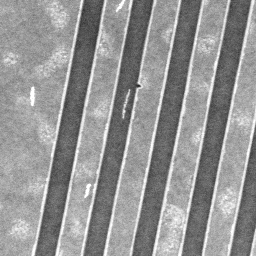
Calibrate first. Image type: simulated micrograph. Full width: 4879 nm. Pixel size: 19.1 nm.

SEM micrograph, parallel lines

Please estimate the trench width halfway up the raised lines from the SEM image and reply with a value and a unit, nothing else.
423 nm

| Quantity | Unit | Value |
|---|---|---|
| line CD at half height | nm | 491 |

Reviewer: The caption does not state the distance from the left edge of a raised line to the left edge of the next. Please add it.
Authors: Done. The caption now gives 0.91 microns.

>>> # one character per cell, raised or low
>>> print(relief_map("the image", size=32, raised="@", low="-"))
@@@@@@@@@@---@@@---@@@---@@@@--@
@@@@@@@@@@---@@@---@@@---@@@---@
@@@@@@@@@@---@@@---@@@---@@@---@
@@@@@@@@@@---@@@---@@@---@@@---@
@@@@@@@@@@--@@@@--@@@@---@@@---@
@@@@@@@@@---@@@---@@@@--@@@@--@@
@@@@@@@@@---@@@---@@@---@@@---@@
@@@@@@@@@---@@@---@@@---@@@---@@
@@@@@@@@@---@@@---@@@---@@@---@@
@@@@@@@@@--@@@@--@@@@---@@@---@@
@@@@@@@@---@@@---@@@@--@@@@---@@
@@@@@@@@---@@@---@@@---@@@---@@@
@@@@@@@@---@@@---@@@---@@@---@@@
@@@@@@@@---@@@---@@@---@@@---@@@
@@@@@@@@--@@@@---@@@---@@@---@@@
@@@@@@@---@@@---@@@@--@@@@--@@@@
@@@@@@@---@@@---@@@---@@@---@@@@
@@@@@@@---@@@---@@@---@@@---@@@-
@@@@@@@---@@@---@@@---@@@---@@@-
@@@@@@@--@@@@---@@@---@@@---@@@-
@@@@@@---@@@@--@@@@--@@@@--@@@@-
@@@@@@---@@@---@@@---@@@---@@@@-
@@@@@@---@@@---@@@---@@@---@@@--
@@@@@@---@@@---@@@---@@@---@@@--
@@@@@@--@@@@---@@@---@@@---@@@--
@@@@@---@@@@--@@@@--@@@@--@@@@--
@@@@@---@@@---@@@---@@@@--@@@@--
@@@@@---@@@---@@@---@@@---@@@---
@@@@@---@@@---@@@---@@@---@@@---
@@@@@--@@@@--@@@@---@@@---@@@---
@@@@---@@@---@@@@--@@@@---@@@---
@@@@---@@@---@@@---@@@@--@@@@--@